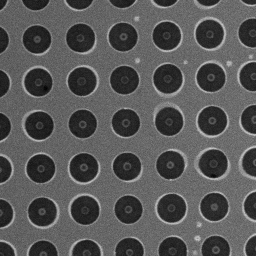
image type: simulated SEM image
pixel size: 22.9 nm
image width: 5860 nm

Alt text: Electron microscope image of an array of small figures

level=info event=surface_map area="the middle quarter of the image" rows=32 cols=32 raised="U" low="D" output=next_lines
UUUUDUUUUUUUUUDDUUUUUUUUDDDDUUUU
UUDDDDDUUUUUDDDDDDUUUUUDDDDDDUUU
UDDDDDDDUUUUDDDDDDDUUUDDDDDDDDUU
UDDDUDDDUUUDDDDUDDDUUUDDDUUDDDUU
UDDUUDDDUUUDDDDUDDDUUUDDDUDDDDUU
UDDDDDDDUUUUDDDDDDUUUUUDDDDDDDUU
UDDDDDDDUUUUDDDDDDUUUUUDDDDDDUUU
UUUDDDDUUUUUUUDDDUUUUUUUDDDUUUUU
UUUUUUUUUUUUUUUUUUUUUUUUUUUUUUUU
UUUUUUUUUUUUUUUUUUUUUUUUUUUUUUUU
UUUUUUUUUUUUUUUUUUUUUUUUUDDDUUUU
UUUUDDUUUUUUUUDDDUUUUUUDDDDDDUUU
UUDDDDDUUUUUUDDDDDUUUUUDDDDDDDUU
UDDDDDDDUUUUDDDDDDDUUUUDDDDDDDUU
UDDDUDDDUUUUDDDUDDDUUUUDDDUDDDUU
UDDDUDDDUUUUDDDUDDDUUUUDDDDDDDUU
UDDDDDDDUUUUDDDDDDDUUUUDDDDDDUUU
UUDDDDDUUUUUUDDDDDUUUUUUDDDDUUUU
UUUUDDUUUUUUUUUUUUUUUUUUUUUUUUUU
UUUUUUUUUUUUUUUUUUUUUUUUUUUUUUUU
UUUUUUUUUUUUUUUUUUUUUUUUUUUUUUUU
UUUUUUUUUUUUUUUUUUUUUUUUUUUUUUUU
UUUDDDUUUUUUUUDDDDUUUUUUDDDDDUUU
UUDDDDDDUUUUUDDDDDDUUUUDDDDDDDUU
UUDDDDDDDUUUDDDDDDDUUUUDDDDDDDDU
UDDDUUDDDUUUDDDUUDDUUUUDDDUDDDUU
UDDDDDDDDUUUDDDDDDDDUUUDDDDDDDUU
UDDDDDDDDUUUUDDDDDDUUUUUDDDDDDUU
UUDDDDDDUUUUUDDDDDUUUUUUUDDDDUUU
UUUDDDUUUUUUUUUUUUUUUUUUUUUUUUUU
UUUUUUUUUUUUUUUUUUUUUUUUUUUUUUUU
UUUUUUUUUUUUUUUUUUUUUUUUUUUUUUUU